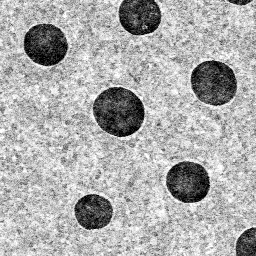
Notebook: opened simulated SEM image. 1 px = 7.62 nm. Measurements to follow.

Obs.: holes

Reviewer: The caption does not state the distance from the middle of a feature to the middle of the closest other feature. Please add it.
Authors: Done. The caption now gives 0.755 micrometres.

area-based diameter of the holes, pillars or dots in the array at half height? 0.335 µm